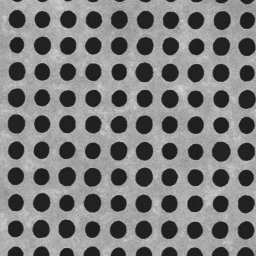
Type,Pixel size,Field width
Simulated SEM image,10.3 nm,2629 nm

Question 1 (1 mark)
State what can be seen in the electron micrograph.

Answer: a regular array of holes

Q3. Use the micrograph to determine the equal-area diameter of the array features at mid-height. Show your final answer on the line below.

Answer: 17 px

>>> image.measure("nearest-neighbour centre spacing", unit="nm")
261